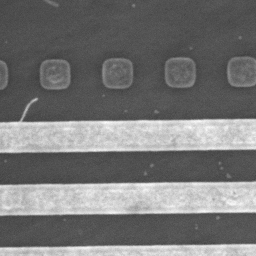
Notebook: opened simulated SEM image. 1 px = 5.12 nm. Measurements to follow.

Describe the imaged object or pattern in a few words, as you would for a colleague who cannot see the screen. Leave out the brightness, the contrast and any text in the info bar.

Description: wiring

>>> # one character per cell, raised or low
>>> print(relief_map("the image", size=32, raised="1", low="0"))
00000000000000000000000000000000
00000000000000000000000000000000
00000000000000000000000000000000
00000000000000000000000000000000
00000000000000000000000000000000
00000000000000000000000000000000
00000000000000000000000000000000
00000000000000110000011100000111
10000111100001110000011100000111
10000111100001110000011100000111
10000111000001110000011100000111
00000000000000000000000000000000
00000000000000000000000000000000
00000000000000000000000000000000
00000000000000000000000000000000
11111111111111111111111111111111
11111111111111111111111111111111
11111111111111111111111111111111
11111111111111111111111111111110
00000000000000000000000000000000
00000000000000000000000000000000
00000000000000000000000000000000
00000000000000000000000000000000
11111111111111111111111111111111
11111111111111111111111111111111
11111111111111111111111111111111
11111111111111111111110000000000
00000000000000000000000000000000
00000000000000000000000000000000
00000000000000000000000000000000
00000000000000000000000000000000
11111111111111111111111111111111